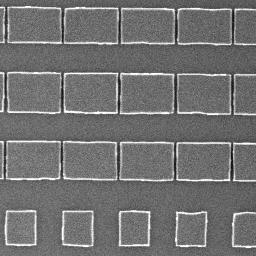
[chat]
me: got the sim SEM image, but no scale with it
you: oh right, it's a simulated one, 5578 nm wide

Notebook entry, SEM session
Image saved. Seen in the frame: wiring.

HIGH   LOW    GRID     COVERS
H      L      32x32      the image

LLLLLLLLLLLLLLLLLLLLLLLLLLLLLLLL
HHHHHHHHHHHHHHHHHHHHHHHHHHHHHHHH
HHHHHHHHHHHHHHHHHHHHHHHHHHHHHHHH
LHHHHHHHHHHHHHHHHHHHHHHHHHHHHHHH
HHHHHHHHHHHHHHHHHHHHHHHHHHHHHHHH
LLLLLLLLLLLLLLLLLLLLLLLLLLLLLLLL
LLLLLLLLLLLLLLLLLLLLLLLLLLLLLLLL
LLLLLLLLLLLLLLLLLLLLLLLLLLLLLLLL
LLLLLLLLLLLLLLLLLLLLLLLLLLLLLLLL
HHHHHHHHHHHHHHHHHHHHHHHHHHHHLLHH
HHHHHHHHHHHHHHHHHHHHHHHHHHHHHHHH
HHHHHHHHHHHHHHHHHHHHHHHHHHHHHHHH
HHHHHHHHHHHHHHHHHHHHHHHHHHHHHHHH
LHHHHHHHHHHHHHHHHHHHHHHHHHHHHHHH
LLLLLLLLLLLLLLLLLLLLLLLLLLLLLLLL
LLLLLLLLLLLLLLLLLLLLLLLLLLLLLLLL
LLLLLLLLLLLLLLLLLLLLLLLLLLLLLLLL
LLLLLLLLLLLLLLLLLLLLLLLLLLLLLLLL
HHHHHHHHHHHHHHLHHHHHHHHHHHHHHHHH
HHHHHHHLHHHHHHLHHHHHHHHHHHHHHHHH
HHHHHHHLHHHHHHLHHHHHHHHHHHHHHHHH
LHHHHHHLHHHHHHHHHHHHHHHHHHHHHHHH
LLLLLLLLLLLLLLLLLLHHHLLHHHHHLLHH
LLLLLLLLLLLLLLLLLLLLLLLLLLLLLLLL
LLLLLLLLLLLLLLLLLLLLLLLLLLLLLLLL
LLLLLLLLLLLLLLLLLLLLLLLLLLLLLLLL
LHHHLLLLHHHLLLLHHHLLLLLLLLLLLLLL
LHHHLLLLHHHHLLLHHHHLLLHHHHLLLHHH
LHHHLLLLHHHLLLLHHHHLLLHHHHLLLHHH
LHHHLLLLHHHHLLLHHHHLLLHHHHLLLHHH
LHHHLLLLHHHLLLLHHHLLLLHHHLLLLHHH
LLLLLLLLLLLLLLLLLLLLLLLLLLLLLLLL